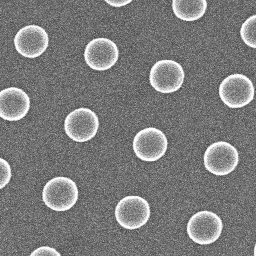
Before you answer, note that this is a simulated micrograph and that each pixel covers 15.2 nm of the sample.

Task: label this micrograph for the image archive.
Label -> a regular array of raised bodies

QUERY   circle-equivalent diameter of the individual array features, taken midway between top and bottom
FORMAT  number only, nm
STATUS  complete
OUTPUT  486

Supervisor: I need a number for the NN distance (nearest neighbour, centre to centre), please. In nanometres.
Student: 1060